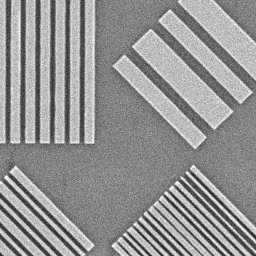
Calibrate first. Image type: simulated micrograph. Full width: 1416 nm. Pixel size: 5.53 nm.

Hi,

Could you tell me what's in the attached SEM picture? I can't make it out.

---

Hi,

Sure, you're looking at groups of lines, slits or small figures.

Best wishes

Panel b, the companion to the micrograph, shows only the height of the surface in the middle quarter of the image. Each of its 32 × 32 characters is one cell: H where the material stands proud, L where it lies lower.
LLHHLHHLLLLLLHHHHHLLLLHHHHHHHHHL
LLHHLHHHLLLLLHHHHHHLLLLHHHHHHHHH
LLHHLHHHLLLLLLHHHHHHLLLLHHHHHHHH
LLHHLHHLLLLLLLLHHHHHHLLLLHHHHHHH
LLHHLHHLLLLLLLLLHHHHHHLLLLHHHHHH
LLHHLHHLLLLLLLLLLHHHHHHLLLLHHHHH
LLHHLHHLLLLLLLLLLLHHHHHHLLLLHHHH
LLHHLHHLLLLLLLLLLLLHHHHHHLLLLHHH
LLHHLHHLLLLLLLLLLLLLHHHHHHLLLLHH
LLHHLHHLLLLLLLLLLLLLLHHHHHHLLLLH
LLHHLHHLLLLLLLLLLLLLLLHHHHHHLLLL
LLHHLHHLLLLLLLLLLLLLLLLHHHHHHLLL
LLHHLHHLLLLLLLLLLLLLLLLLHHHHHHLL
LLHHLHHLLLLLLLLLLLLLLLLLLHHHHHHL
LLHHLHHLLLLLLLLLLLLLLLLLLLHHHHHH
LLHHLHHLLLLLLLLLLLLLLLLLLLLHHHHH
LLHHLHHLLLLLLLLLLLLLLLLLLLLLHHHH
LLHHLHHLLLLLLLLLLLLLLLLLLLLLLHHH
LHHHLHHLLLLLLLLLLLLLLLLLLLLLLLHH
LHHHLHHLLLLLLLLLLLLLLLLLLLLLLLLH
LLLLLLLLLLLLLLLLLLLLLLLLLLLLLLLL
LLLLLLLLLLLLLLLLLLLLLLLLLLLLLLLL
LLLLLLLLLLLLLLLLLLLLLLLLLLLLLLLL
LLLLLLLLLLLLLLLLLLLLLLLLLLLLLLLL
LLLLLLLLLLLLLLLLLLLLLLLLLLLLLLLL
LLLLLLLLLLLLLLLLLLLLLLLLLLLLLLLL
LLLLLLLLLLLLLLLLLLLLLLLLLLLLLLLL
LLLLLLLLLLLLLLLLLLLLLLLLLLLLLLLH
LLLLLLLLLLLLLLLLLLLLLLLLLLLLLLLL
LLLLLLLLLLLLLLLLLLLLLLLLLLLLLLLL
LLLLLLLLLLLLLLLLLLLLLLLLLLLLHHLL
LLLLLLLLLLLLLLLLLLLLLLLLLLLHLHHL